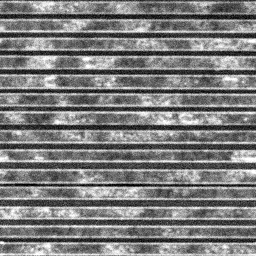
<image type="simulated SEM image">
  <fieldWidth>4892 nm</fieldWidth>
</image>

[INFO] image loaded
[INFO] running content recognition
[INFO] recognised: parallel lines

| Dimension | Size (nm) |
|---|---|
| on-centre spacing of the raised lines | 354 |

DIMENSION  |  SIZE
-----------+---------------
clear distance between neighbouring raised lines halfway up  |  124 nm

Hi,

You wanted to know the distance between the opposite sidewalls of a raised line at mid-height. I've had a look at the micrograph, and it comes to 232 nm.